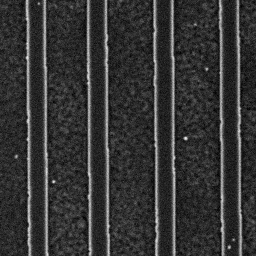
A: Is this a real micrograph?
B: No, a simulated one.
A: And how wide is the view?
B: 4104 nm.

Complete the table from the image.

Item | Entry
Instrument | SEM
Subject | lines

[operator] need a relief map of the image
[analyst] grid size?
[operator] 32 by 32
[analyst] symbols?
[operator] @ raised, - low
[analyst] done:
---@@@-----@@------@@@-----@@@--
---@@@-----@@------@@@-----@@@--
---@@@-----@@------@@@-----@@@--
---@@@-----@@------@@@-----@@@--
---@@@-----@@------@@@------@@--
---@@@-----@@------@@@------@@--
---@@@-----@@------@@@------@@--
---@@@-----@@------@@@------@@--
---@@@-----@@------@@@------@@--
---@@@-----@@------@@@-----@@@--
---@@@-----@@------@@@------@@--
---@@@-----@@------@@@------@@--
---@@@-----@@------@@@------@@--
---@@@-----@@------@@@------@@--
---@@@-----@@------@@@------@@--
---@@@-----@@------@@@------@@--
----@@-----@@------@@@------@@--
---@@@-----@@------@@@------@@--
----@@-----@@@-----@@@------@@--
---@@@-----@@@------@@------@@--
----@@-----@@@------@@------@@--
----@@-----@@@------@@------@@--
----@@-----@@@------@@------@@--
----@@-----@@@------@@------@@--
----@@-----@@@------@@------@@--
----@@-----@@@------@@------@@--
----@@-----@@@------@@------@@--
----@@-----@@@------@@------@@--
----@@-----@@@------@@------@@--
----@@-----@@@------@@------@@--
----@@-----@@@------@@------@@--
----@@-----@@@------@@------@@--